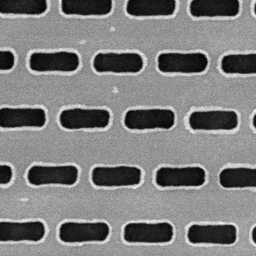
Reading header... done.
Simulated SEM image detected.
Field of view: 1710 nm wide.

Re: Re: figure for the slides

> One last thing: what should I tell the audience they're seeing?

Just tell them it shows a regular array of holes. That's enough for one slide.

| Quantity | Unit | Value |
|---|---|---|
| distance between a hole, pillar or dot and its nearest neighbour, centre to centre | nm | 428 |